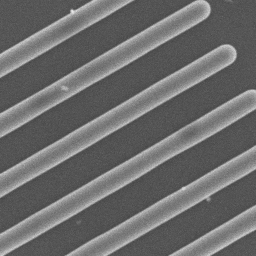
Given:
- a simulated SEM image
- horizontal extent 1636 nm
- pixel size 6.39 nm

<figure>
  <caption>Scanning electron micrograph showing groups of lines, slits or small figures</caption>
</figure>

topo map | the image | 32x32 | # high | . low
...........#####........##......
.........#####........####......
.......#####........#####.......
......#####........#####........
....#####........#####..........
..#####........#####............
######.......#####........###...
####........#####........####...
##........#####........#####....
........#####........#####......
.......#####.......######.......
.....#####........#####........#
...#####........#####........###
.#####........#####........#####
#####........#####.......######.
###........#####........#####...
#........#####........#####.....
.......#####........#####.......
......#####........#####........
....#####........#####........##
..#####........#####........####
.#####.......#####........#####.
####........#####........#####..
##........#####........#####....
........#####........#####......
......######.......#####........
.....#####........#####.......##
...#####........#####........###
.#####........#####........#####
#####.......######.......#####..
###........#####........#####...
#........#####........#####.....